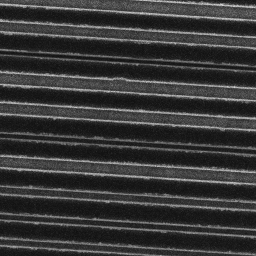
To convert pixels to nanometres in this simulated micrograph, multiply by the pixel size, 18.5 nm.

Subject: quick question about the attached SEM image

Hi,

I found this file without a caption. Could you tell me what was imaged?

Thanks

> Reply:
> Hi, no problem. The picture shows parallel lines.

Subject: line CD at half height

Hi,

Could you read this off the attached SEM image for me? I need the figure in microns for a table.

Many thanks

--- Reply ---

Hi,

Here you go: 0.357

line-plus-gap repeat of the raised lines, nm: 499